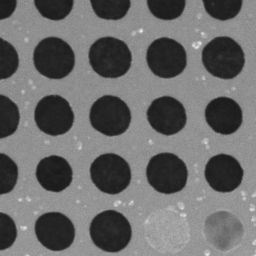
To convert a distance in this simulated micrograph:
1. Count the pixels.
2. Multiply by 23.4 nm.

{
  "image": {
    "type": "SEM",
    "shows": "a regular array of holes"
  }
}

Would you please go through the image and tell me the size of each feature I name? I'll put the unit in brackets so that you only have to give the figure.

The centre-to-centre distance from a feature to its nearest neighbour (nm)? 1320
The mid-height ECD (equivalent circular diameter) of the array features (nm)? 964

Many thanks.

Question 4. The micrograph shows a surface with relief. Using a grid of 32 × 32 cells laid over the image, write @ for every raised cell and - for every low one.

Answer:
--@@-----@@-----@@-----@@-----@@
--@@@----@@@----@@@----@@@----@@
@@@@@@@@@@@@@@@@@@@@@@@@@@@-@@@@
@@@@@@@@@@@@@@@@@@@@@@@@@@@@@@@@
@@@@@@@@@@@@@@@@@@@@@@@@@@@@@@@@
-@@@@----@@@----@@@----@@@----@@
--@@-----@@-----@@-----@@-----@@
--@@-----@@-----@@-----@@------@
--@@-----@@@----@@@----@@@----@@
-@@@@@--@@@@@--@@@@@--@@@@@---@@
@@@@@@@@@@@@@@@@@@@@@@@@@@@@@@@@
@@@@@@@@@@@@@@@@@@@@@@@@@@@@@@@@
-@@@@---@@@@---@@@@---@@@@@--@@@
--@@-----@@-----@@@----@@@----@@
---@-----@@-----@@-----@@@----@@
--@@@----@@-----@@@----@@@----@@
--@@@---@@@@----@@@@--@@@@@--@@@
@@@@@@@@@@@@@@@@@@@@@@@@@@@@@@@@
@@@@@@@@@@@@@@@@@@@@@@@@@@@@@@@@
-@@@@@-@@@@@---@@@@---@@@@@--@@@
--@@@----@@-----@@-----@@@----@@
--@@-----@@-----@@-----@@@----@@
--@@@----@@-----@@-----@@@----@@
--@@@---@@@@----@@@----@@@----@@
@@@@@@@@@@@@@@@@@@@@@@@@@@@@@@@@
@@@@@@@@@@@@@@@@@@@@@@@@@@@@@@@@
@@@@@@-@@@@@@--@@@@@@@@@@@@@@@@@
--@@@----@@@----@@@@@@@@@@@@@@@@
--@@-----@@-----@@@@@@@@@@@@@@@@
--@@-----@@-----@@@@@@@@@@@@@@@@
--@@@----@@@----@@@@@@@@@@@@@@@@
@@@@@@@@@@@@@@@@@@@@@@@@@@@@@@@@